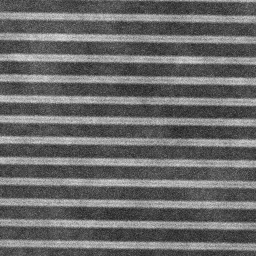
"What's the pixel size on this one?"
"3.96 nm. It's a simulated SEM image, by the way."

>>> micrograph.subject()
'parallel lines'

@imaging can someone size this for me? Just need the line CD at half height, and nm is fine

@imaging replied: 20.3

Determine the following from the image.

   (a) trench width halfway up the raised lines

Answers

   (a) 0.0614 micrometres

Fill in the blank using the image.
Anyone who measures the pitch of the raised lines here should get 82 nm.